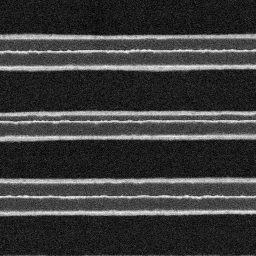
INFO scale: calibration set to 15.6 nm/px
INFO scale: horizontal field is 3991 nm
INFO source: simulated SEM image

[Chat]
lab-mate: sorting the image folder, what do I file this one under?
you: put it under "lines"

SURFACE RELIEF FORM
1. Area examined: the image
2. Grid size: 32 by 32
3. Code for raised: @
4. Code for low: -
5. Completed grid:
--------------------------------
--------------------------------
--------------------------------
--------------------------------
--------------------------------
@@@@@@@@@@@@@@@@@@@@@@@@@@@@@@@@
@@@@@@@@@@@@@@@@@@@@@@@@@@@@@@@@
@@@@@@@@@@@@@@@@@@@@@@@@@@@@@@@@
--------------------------------
--------------------------------
--------------------------------
--------------------------------
--------------------------------
--------------------------------
@@@@@@@@@@@@@@@@@@@@@@@@@@@@@@@@
@@@@@@@@@@@@@@@@@@@@@@@@@@@@@@@@
@@@@@@@@@@@@@@@@@@@@@@@@@@@@@@@@
--------------------------------
--------------------------------
--------------------------------
--------------------------------
--------------------------------
--------------------------------
@@@@@@@@@@@@@@@@@@@@@@@@@@@@@@@@
@@@@@@@@@@@@@@@@@@@@@@@@@@@@@@@@
@@@@@@@@@@@@@@@@@@@@@@@@@@@@@@@@
@@@@@@@@@@@@@@@@@@@@@@@---------
--------------------------------
--------------------------------
--------------------------------
--------------------------------
--------------------------------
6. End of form